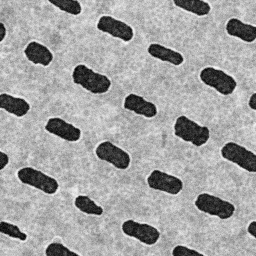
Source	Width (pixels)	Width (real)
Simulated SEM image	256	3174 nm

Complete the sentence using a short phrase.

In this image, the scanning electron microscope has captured a regular array of holes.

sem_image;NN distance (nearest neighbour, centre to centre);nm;694